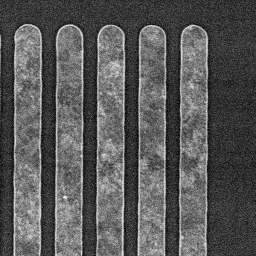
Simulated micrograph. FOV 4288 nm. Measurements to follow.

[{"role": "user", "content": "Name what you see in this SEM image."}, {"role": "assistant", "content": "groups of lines, slits or small figures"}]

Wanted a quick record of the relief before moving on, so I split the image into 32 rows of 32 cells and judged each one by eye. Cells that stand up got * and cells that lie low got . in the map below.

................................
................................
................................
..***...**...**...**...**.......
..***..***..***...***..***......
..***..***..***..****..***......
..***..***..****.****..***......
..***..***..****.****..***......
..***..***..****..***..***......
..***..***..***...***..***......
..***..***..***..****..***......
..***..***..***..****..***......
..***..***..***..****..***......
..***..***..***..****..***......
..***..***..***..****..***......
..***..***..***..****..***......
..***..***..***..****..***......
..***..***..***..****..***......
..***..***..***..****..***......
..***..***..***..****..***......
..***..***..***..****..***......
..***..***..***..****..***......
..***..***..***..****..***......
..***..***..***..****..***......
..***..***..***..****.****......
..***..***..***..****.****......
..***..***..***..****..***......
..***..***..***..****..***......
..***..***..***..***...***......
..***..***..***..***...***......
..***..***..***..***...***......
..***..***..***..****..***......